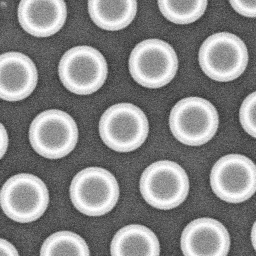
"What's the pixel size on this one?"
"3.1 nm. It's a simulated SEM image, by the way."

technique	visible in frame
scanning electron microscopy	an array of small figures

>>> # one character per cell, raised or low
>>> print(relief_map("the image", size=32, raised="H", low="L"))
LLHHHHHHLLLHHHHHHLLLHHHHHHLLLHHH
LLHHHHHHLLLHHHHHHLLLHHHHHLLLLLHH
LLHHHHHHLLLLHHHHHLLLLHHHLLLLLLLL
LLLHHHHHLLLLLHHLLLLLLLLLLLLLLLLL
LLLLHHLLLLLLLLLLLLLLLLLLLLHHHLLL
LLLLLLLLLLLLLLLLLHHHHLLLLHHHHHLL
LLLLLLLLHHHHLLLLHHHHHHLLLHHHHHHL
HHHHLLLLHHHHHLLLHHHHHHLLLHHHHHHL
HHHHLLLHHHHHHLLLHHHHHHLLLHHHHHHL
HHHHHLLHHHHHHLLLHHHHHHLLLLHHHHLL
HHHHLLLLHHHHHLLLLHHHHLLLLLLLLLLL
HHHHLLLLLHHHLLLLLLLLLLLLLLLLLLLL
LHLLLLLLLLLLLLLLLLLLLLLHHHLLLLLH
LLLLLLLLLLLLLLHHHLLLLLHHHHHLLLHH
LLLLLHHHHLLLLHHHHHLLLHHHHHHLLLHH
LLLLHHHHHLLLHHHHHHLLLHHHHHHLLLHH
HLLLHHHHHHLLHHHHHHLLLHHHHHHLLLLH
HLLLHHHHHHLLLHHHHHLLLLHHHHLLLLLL
HLLLHHHHHLLLLLHHHLLLLLLLLLLLLLLL
LLLLLHHHLLLLLLLLLLLLLLLLLLLLHHLL
LLLLLLLLLLLLLLLLLLLHHHLLLLLHHHHH
LLLLLLLLLLHHHHLLLLHHHHHLLLHHHHHH
LHHHHLLLLHHHHHLLLLHHHHHHLLHHHHHH
HHHHHHLLLHHHHHHLLLHHHHHHLLLHHHHH
HHHHHHLLLHHHHHHLLLHHHHHLLLLHHHHL
HHHHHHLLLHHHHHLLLLLHHHLLLLLLLLLL
LHHHHLLLLLHHHLLLLLLLLLLLLLLLLLLL
LLHHLLLLLLLLLLLLLLLLLLLLHHHLLLLL
LLLLLLLLLLLLLLLHHHLLLLLHHHHHLLLL
LLLLLLHHHHLLLLHHHHHLLLLHHHHHHLLH
HLLLLHHHHHHLLLHHHHHHLLLHHHHHHLLL
HHLLLHHHHHHLLLHHHHHHLLLHHHHHLLLL